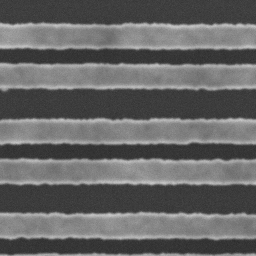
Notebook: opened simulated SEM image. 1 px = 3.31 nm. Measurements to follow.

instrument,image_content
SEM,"lines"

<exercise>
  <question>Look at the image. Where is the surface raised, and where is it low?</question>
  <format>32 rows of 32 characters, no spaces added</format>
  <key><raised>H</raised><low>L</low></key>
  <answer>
LLLLLLLLLLLLLLLLLLLLLLLLLLLLLLLL
LLLLLLLLLLLLLLLLLLLLLLLLLLLLLLLL
LLLLLLLLLLLLLLLLLLLLLLLLLLLLLLLL
HHHHHHHHHHHHHHHHHHHHHHHHHHHHHHHH
HHHHHHHHHHHHHHHHHHHHHHHHHHHHHHHH
HHHHHHHHHHHHHHHHHHHHHHHHHHHHHHHH
LLLLLLLLLLLLLLLLLLLLLLLLLLLLLLLL
LLLLLLLLLLLLLLLLLLLLLLLLLLLLLLLL
HHHHHHHHHHHHHHHHHHHHHHHHHHHHHHHH
HHHHHHHHHHHHHHHHHHHHHHHHHHHHHHHH
HHHHHHHHHHHHHHHHHHHHHHHHHHHHHHHH
LLLLLLLLLLLLLLLLLLLLLLLLLLLLLLLL
LLLLLLLLLLLLLLLLLLLLLLLLLLLLLLLL
LLLLLLLLLLLLLLLLLLLLLLLLLLLLLLLL
LLLLLLLLLLLLLLLLLLLLLLLLLLLLLLLL
HHHHHHHHHHHHHHHHHHHHHHHHHHHHHHHH
HHHHHHHHHHHHHHHHHHHHHHHHHHHHHHHH
HHHHHHHHHHHHHHHHHHHHHHHHHHHHHHHH
LLLLLLLLLLLLLLLLLLLLLLLLLLLLLLLL
LLLLLLLLLLLLLLLLLLLLLLLLLLLLLLLL
HHHHHHHHHHHHHHHHHHHHHHHHHHHHHHHH
HHHHHHHHHHHHHHHHHHHHHHHHHHHHHHHH
HHHHHHHHHHHHHHHHHHHHHHHHHHHHHHHH
LLLLLLLLLLLLLLLLLLLLLLLLLLLLLLLL
LLLLLLLLLLLLLLLLLLLLLLLLLLLLLLLL
LLLLLLLLLLLLLLLLLLLLLLLLLLLLLLLL
LLLLLLLLLLLLLLLLLLLLLLLLLLLLLLLL
HHHHHHHHHHHHHHHHHHHHHHHHHHHHHHHH
HHHHHHHHHHHHHHHHHHHHHHHHHHHHHHHH
HHHHHHHHHHHHHHHHHHHHHHHHHHHHHHHH
LLLLLLLLLLLLLLLLLLLLLLLLLLLLLLLL
LLLLLLLLLLLLLLLLLLLLLLLLLLLLLLLL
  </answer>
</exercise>